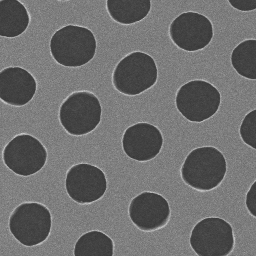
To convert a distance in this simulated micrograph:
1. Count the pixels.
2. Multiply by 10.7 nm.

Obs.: a regular array of holes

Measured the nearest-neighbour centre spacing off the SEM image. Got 722 nm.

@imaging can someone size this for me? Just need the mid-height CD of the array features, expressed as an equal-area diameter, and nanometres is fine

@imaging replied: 446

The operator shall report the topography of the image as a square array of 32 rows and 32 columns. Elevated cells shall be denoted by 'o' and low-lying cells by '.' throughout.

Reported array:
...oooooooooo......oooooooooo...
...ooooooooooo.....ooooooooooooo
....oooooooooo....oooo....oooooo
...ooooo..ooooooooooo.....oooooo
..ooooo.....ooooooooo......ooooo
oooooo......oooooooooo....oooo..
oooooo......ooooooooooooooooo...
ooooooo....oooo....oooooooooo...
o..oooooooooooo.....ooooooooo...
....oooooooooo......oooooooooo..
....oooooooooo.....oooo...oooooo
....ooooooooooo...oooo.....ooooo
....oooo....oooooooooo......oooo
oooooooo.....ooooooooo.....ooooo
oooooooo.....oooooooooo...ooooo.
oooooooo....ooooo..ooooooooooo..
ooooooooo..ooooo....oooooooooo..
oo...oooooooooo.....oooooooooo..
o....oooooooooo.....ooooo..ooooo
o.....oooooooooo...ooooo....oooo
o.....oooo.oooooooooooo.....oooo
oo...oooo....oooooooooo.....oooo
oooooooo.....oooooooooo.....oooo
oooooooo.....oooooooooooo..oooo.
ooooooooo....oooo...ooooooooooo.
ooo..ooooooooooo.....oooooooooo.
oo....oooooooooo.....oooooooooo.
o.....ooooooooooo....oooo...oooo
o.....oooooooooooo.ooooo.....ooo
oo....oooo...ooooooooooo.....ooo
ooo..oooo.....oooooooooo.....ooo
ooooooooo.....oooooooooo.....ooo